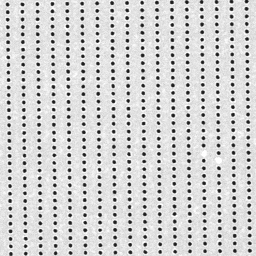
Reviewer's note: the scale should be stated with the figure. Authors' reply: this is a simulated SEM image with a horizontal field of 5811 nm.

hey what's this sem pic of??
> a regular array of holes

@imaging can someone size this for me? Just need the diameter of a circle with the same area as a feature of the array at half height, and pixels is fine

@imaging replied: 4.37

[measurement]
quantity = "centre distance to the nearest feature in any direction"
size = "168 nanometres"